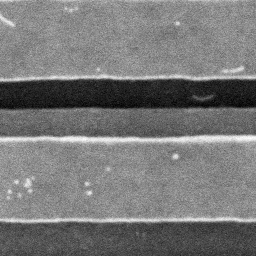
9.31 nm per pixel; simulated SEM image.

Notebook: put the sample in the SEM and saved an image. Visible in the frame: lines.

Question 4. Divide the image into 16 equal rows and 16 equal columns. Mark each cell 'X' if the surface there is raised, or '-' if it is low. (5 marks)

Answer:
XXXXXXXXXXXXXXXX
XXXXXXXXXXXXXXXX
XXXXXXXXXXXXXXXX
XXXXXXXXXXXXXXXX
XXXXXXXXXXXXXXXX
----------------
----------------
----------------
----------------
XXXXXXXXXXXXXXXX
XXXXXXXXXXXXXXXX
XXXXXXXXXXXXXXXX
XXXXXXXXXXXXXXXX
XXXXXXXXXXXXXXXX
----------------
----------------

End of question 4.